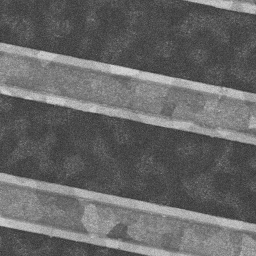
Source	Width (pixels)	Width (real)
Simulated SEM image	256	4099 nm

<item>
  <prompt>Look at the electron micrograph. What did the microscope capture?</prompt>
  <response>one or a few lines or trenches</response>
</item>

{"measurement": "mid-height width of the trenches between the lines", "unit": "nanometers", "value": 1380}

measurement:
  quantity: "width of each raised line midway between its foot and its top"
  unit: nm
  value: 669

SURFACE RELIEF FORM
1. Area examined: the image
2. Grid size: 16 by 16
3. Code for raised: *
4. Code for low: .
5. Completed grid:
...............*
................
................
***.............
********........
*************...
.....***********
.........*******
...............*
................
................
**..............
*******.........
************....
...*************
........********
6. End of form